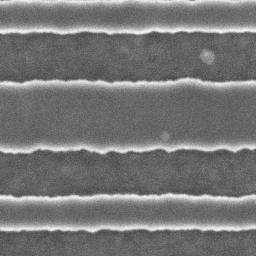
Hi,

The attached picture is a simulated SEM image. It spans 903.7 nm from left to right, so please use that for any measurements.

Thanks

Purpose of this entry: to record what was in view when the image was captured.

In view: lines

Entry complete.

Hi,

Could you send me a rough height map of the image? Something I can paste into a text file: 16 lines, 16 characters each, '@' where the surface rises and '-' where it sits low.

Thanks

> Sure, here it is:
@@@@@@@@@@@@@@@@
@@@@@@@@@@@@@@@@
----------------
----------------
----------------
@@@@@@@@@@@@@@@@
@@@@@@@@@@@@@@@@
@@@@@@@@@@@@@@@@
@@@@@@@@@@@@@@@@
@@----@---------
----------------
----------------
@@@@@@@@@@@@@@@@
@@@@@@@@@@@@@@@@
----------------
----------------